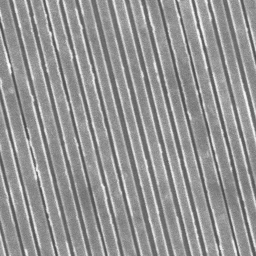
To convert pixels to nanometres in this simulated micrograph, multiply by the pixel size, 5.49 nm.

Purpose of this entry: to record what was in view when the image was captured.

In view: parallel lines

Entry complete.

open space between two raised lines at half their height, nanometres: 20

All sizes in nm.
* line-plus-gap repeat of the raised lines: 87.9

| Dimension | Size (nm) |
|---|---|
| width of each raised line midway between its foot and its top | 64.6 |